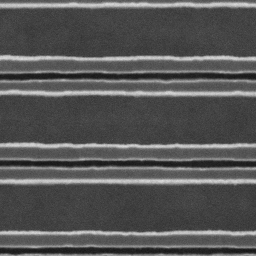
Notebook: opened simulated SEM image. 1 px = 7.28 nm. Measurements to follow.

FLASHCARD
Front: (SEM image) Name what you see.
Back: lines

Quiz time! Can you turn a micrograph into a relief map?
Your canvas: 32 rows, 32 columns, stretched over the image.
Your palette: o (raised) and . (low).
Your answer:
oooooooooooooooooooooooooooooooo
................................
................................
................................
................................
................................
................................
oooooooooooooooooooooooooooooooo
oooooooooooooooooooooooooooooooo
oooooooooooooooooooooooooooooooo
oooooooooooooooooooooooooooooooo
....oooooooooooooooooooooooooooo
................................
................................
................................
................................
................................
................................
oooooooooooooooooooooooooooooooo
oooooooooooooooooooooooooooooooo
oooooooooooooooooooooooooooooooo
oooooooooooooooooooooooooooooooo
ooooooo....o.o.o.ooooooooooooooo
................................
................................
................................
................................
................................
................................
oooooooooooooooooooooooooooooooo
oooooooooooooooooooooooooooooooo
oooooooooooooooooooooooooooooooo